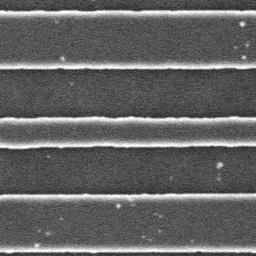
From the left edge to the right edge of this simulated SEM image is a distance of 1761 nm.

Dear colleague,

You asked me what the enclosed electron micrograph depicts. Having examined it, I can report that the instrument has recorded lines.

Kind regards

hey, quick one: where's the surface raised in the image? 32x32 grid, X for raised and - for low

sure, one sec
--------------------------------
X---XX-XXX-XXXXXXXXXXXXXXXXXXXXX
XXXXXXXXXXXXXXXXXXXXXXXXXXXXXXXX
XXXXXXXXXXXXXXXXXXXXXXXXXXXXXXXX
XXXXXXXXXXXXXXXXXXXXXXXXXXXXXXXX
XXXXXXXXXXXXXXXXXXXXXXXXXXXXXXXX
XXXXXXXXXXXXXXXXXXXXXXXXXXXXXXXX
XXXXXXXXXXXXXXXXXXXXXXXXXXXXXXXX
XXXXXXX-XXXXXXXXXXXXXXXXXXXX-XX-
--------------------------------
--------------------------------
--------------------------------
--------------------------------
--------------------------------
--------------------------------
XXXXXXXXXXXXXXXXXXXXXXXXXXXXXXXX
XXXXXXXXXXXXXXXXXXXXXXXXXXXXXXXX
XXXXXXXXXXXXXXXXXXXXXXXXXXXXXXXX
--------------------------------
--------------------------------
--------------------------------
--------------------------------
--------------------------------
--------------------------------
XXXXXXXXXXXXXXXXXXXXXXXXXXXXXXXX
XXXXXXXXXXXXXXXXXXXXXXXXXXXXXXXX
XXXXXXXXXXXXXXXXXXXXXXXXXXXXXXXX
XXXXXXXXXXXXXXXXXXXXXXXXXXXXXXXX
XXXXXXXXXXXXXXXXXXXXXXXXXXXXXXXX
XXXXXXXXXXXXXXXXXXXXXXXXXXXXXXXX
XXXXXXXXXXXXXXXXXXXXXXXXXXXXXXXX
XX---------X-------------------X